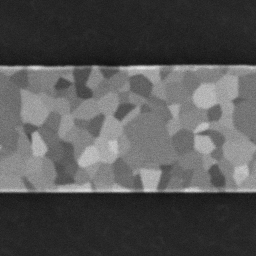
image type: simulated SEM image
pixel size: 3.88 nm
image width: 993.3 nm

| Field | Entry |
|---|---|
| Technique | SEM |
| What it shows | one or a few lines or trenches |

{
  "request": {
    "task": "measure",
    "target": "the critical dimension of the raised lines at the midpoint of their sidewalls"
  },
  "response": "486 nanometres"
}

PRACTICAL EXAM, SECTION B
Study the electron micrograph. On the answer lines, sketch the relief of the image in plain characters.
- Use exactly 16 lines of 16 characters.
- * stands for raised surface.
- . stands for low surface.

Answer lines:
................
................
................
................
****************
****************
****************
****************
****************
****************
****************
****************
................
................
................
................